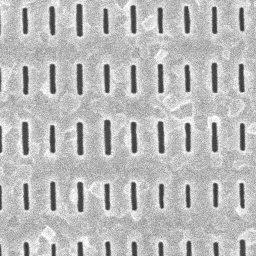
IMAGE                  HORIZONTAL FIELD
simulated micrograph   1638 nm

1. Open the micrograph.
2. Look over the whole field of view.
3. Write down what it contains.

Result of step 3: a regular array of holes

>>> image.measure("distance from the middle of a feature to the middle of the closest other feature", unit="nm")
172